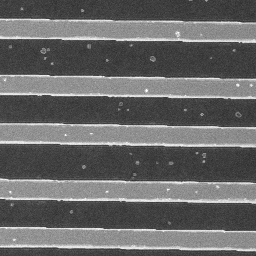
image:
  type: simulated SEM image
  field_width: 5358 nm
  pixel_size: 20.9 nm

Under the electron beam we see lines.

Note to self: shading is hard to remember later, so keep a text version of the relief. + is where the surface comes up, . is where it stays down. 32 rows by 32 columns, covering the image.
................................
................................
++++++..........................
++++++++++++++++++++++++++++++++
++++++++++++++++++++++++++++++++
................................
................................
................................
................................
++++++..........................
++++++++++++++++++++++++++++++++
++++++++++++++++++++++++++++++++
................................
................................
................................
................................
++++++++++++++++++++++++++++++++
++++++++++++++++++++++++++++++++
................................
................................
................................
................................
+...............................
++++++++++++++++++++++++++++++++
++++++++++++++++++++++++++++++++
................................
................................
................................
++++++..........................
++++++++++++++++++++++++++++++++
++++++++++++++++++++++++++++++++
................................